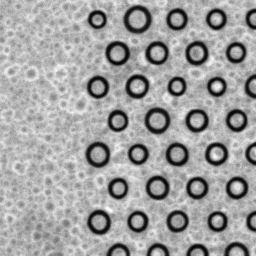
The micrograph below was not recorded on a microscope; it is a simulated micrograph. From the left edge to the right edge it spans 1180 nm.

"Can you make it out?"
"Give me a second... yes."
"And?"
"a regular array of ring-shaped grooves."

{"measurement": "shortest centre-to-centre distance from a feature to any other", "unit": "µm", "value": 0.178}